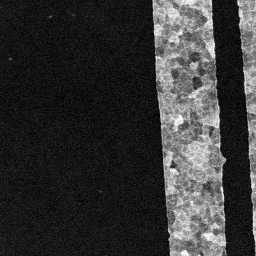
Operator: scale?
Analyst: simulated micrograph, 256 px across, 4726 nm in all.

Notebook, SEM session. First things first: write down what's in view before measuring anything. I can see one or a few lines or trenches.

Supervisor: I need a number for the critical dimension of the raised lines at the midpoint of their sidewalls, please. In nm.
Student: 1050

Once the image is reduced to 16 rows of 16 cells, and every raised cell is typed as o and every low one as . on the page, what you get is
..........ooo..o
..........ooo..o
..........ooo..o
..........ooo..o
..........ooo..o
..........oooo.o
..........oooo.o
..........oooo.o
..........oooo..
..........oooo..
..........oooo..
..........oooo..
..........oooo..
..........oooo..
...........ooo..
...........ooo..